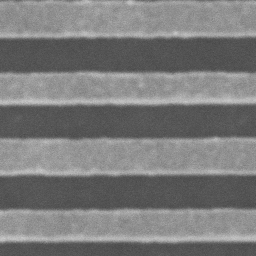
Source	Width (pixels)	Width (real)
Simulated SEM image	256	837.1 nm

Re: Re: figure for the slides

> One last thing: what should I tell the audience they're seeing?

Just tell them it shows lines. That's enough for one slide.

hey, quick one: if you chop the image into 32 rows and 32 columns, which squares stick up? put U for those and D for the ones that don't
UUUUUUUUUUUUUUUUUUUUUUUUUUUUUUUU
UUUUUUUUUUUUUUUUUUUUUUUUUUUUUUUU
UUUUUUUUUUUUUUUUUUUUUUUUUUUUUUUU
UUUUUUUUUUUUUUUUUUUUUUUUUUUUUUUU
UUUUUUUUUUUUUUUUUUUUUUUUUUUUUUDD
DDDDDDDDDDDDDDDDDDDDDDDDDDDDDDDD
DDDDDDDDDDDDDDDDDDDDDDDDDDDDDDDD
DDDDDDDDDDDDDDDDDDDDDDDDDDDDDDDD
DDDDDDDDDDDDDDDDDDDDDDDDDDDDDDDD
UUUUUUUUUUUUUUUUUUUUUUUUUUUUUUUU
UUUUUUUUUUUUUUUUUUUUUUUUUUUUUUUU
UUUUUUUUUUUUUUUUUUUUUUUUUUUUUUUU
UUUUUUUUUUUUUUUUUUUUUUUUUUUUUUUU
DDDDDDDDDDDDDDDDDDDDDDDDDDDDDDDD
DDDDDDDDDDDDDDDDDDDDDDDDDDDDDDDD
DDDDDDDDDDDDDDDDDDDDDDDDDDDDDDDD
DDDDDDDDDDDDDDDDDDDDDDDDDDDDDDDD
UUUUUUUUUDUUUUUUUUUUUUUUUUUUUUUU
UUUUUUUUUUUUUUUUUUUUUUUUUUUUUUUU
UUUUUUUUUUUUUUUUUUUUUUUUUUUUUUUU
UUUUUUUUUUUUUUUUUUUUUUUUUUUUUUUU
UUUUUUUUUUUUUUUUUUUUUUUUUUUUUUUU
DDDDDDDDDDDDDDDDDDDDDDDDDDDDDDDD
DDDDDDDDDDDDDDDDDDDDDDDDDDDDDDDD
DDDDDDDDDDDDDDDDDDDDDDDDDDDDDDDD
DDDDDDDDDDDDDDDDDDDDDDDDDDDDDDDD
UUUUUUUUUUUUUUUUUUUUUUUUUUUUUUUU
UUUUUUUUUUUUUUUUUUUUUUUUUUUUUUUU
UUUUUUUUUUUUUUUUUUUUUUUUUUUUUUUU
UUUUUUUUUUUUUUUUUUUUUUUUUUUUUUUU
DDDDDDDDDDDDDDDDDDDDDDDDDDDDDDDD
DDDDDDDDDDDDDDDDDDDDDDDDDDDDDDDD